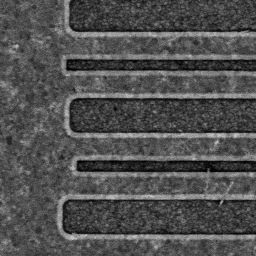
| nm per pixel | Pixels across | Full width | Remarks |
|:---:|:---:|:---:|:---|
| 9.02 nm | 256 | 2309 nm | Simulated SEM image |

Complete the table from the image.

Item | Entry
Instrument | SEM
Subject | parallel lines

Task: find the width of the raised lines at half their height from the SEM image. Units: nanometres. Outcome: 208